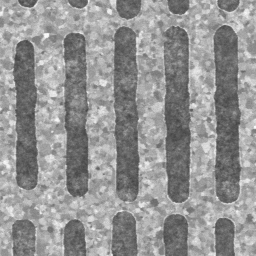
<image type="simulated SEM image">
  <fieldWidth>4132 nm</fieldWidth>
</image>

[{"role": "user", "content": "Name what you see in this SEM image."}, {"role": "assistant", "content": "holes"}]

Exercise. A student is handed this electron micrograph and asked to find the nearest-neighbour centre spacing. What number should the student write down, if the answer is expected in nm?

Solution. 809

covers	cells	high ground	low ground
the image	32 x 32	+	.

+++..++++..+++....+++...+++...++
+++++++++++++++..++++..+++++++++
++++++++++++++++++++++++++++++++
+++++++++++++++.+++++..++++..+++
++++++++..++++...++++...+++...++
++..++++...+++...+++....+++...++
++..++++...+++...+++....+++...++
++..++++...+++...+++....+++...++
++..++++...+++...+++....+++...++
++..++++...+++...++++...+++...++
++...+++...+++...++++...+++...++
++...+++...+++...++++...+++...++
++...+++...+++...+++....+++...++
++..++++...+++...+++....+++...++
++..++++...+++...++++...+++...++
++..++++...+++...++++...+++...++
++..++++...+++...++++...+++...++
++...+++...+++...++++...+++...++
++...+++...+++...++++...+++...++
++...+++...+++...++++...+++...++
++...+++...+++...++++...+++...++
++...+++...+++...++++...+++...++
++...+++...+++...++++...+++...++
+++.++++...+++...++++...+++...++
+++++++++.+++++..++++...+++...++
++++++++++++++++++++++++++++++++
+++++++++++++++.++++++++++++++++
++..+++++.++++...++++..++++..+++
++..++++...+++...+++....+++..+++
++...+++...+++...+++....+++..+++
++...+++...+++...+++....+++..+++
+...++++...+++...+++....+++..+++